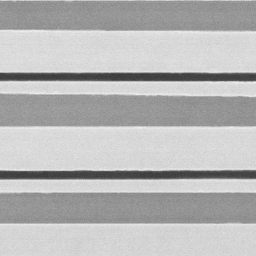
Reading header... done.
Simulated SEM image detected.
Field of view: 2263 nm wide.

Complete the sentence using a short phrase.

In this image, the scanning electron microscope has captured lines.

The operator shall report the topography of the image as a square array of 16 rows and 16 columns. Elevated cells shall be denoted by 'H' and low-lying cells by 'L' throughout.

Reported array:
LLLLLLLLLLLLLLLL
LLLLLLLLLLLLLLLL
HHHHHHHHHHHHHHHH
HHHHHHHHHHHHHHHH
HHHHHHHHHHHHHHHH
HHHHHHHHHHHHHHHH
LLLLLLLLLLLLLLLL
LLLLLLLLLLLLLLLL
HHHHHHHHHHHHHHHH
HHHHHHHHHHHHHHHH
HHHHHHHHHHHHHHHH
HHHHHHHHHHHHHHHH
LLLLLLLLLLLLLLLL
LLLLLLLLLLLLLLLL
HHHHHHHHHHHHHHHH
HHHHHHHHHHHHHHHH